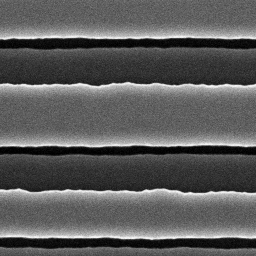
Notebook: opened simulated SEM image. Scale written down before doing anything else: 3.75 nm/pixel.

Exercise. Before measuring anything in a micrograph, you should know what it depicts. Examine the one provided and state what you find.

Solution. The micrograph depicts lines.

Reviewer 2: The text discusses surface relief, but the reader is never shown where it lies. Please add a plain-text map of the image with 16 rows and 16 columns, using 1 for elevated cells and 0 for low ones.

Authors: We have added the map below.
1111111111111111
1111111111111111
0000000000000000
0000000000000000
0000000000000000
1111111111111111
1111111111111111
1111111111111111
1111111111111111
0000000000000000
0000000000000000
0000000000000000
1111111111111111
1111111111111111
1111111111111111
0000000000000000